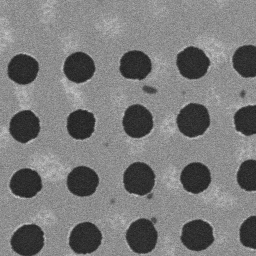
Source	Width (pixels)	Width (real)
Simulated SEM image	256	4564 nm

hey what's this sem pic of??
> a regular array of holes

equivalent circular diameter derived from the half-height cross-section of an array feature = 569 nanometres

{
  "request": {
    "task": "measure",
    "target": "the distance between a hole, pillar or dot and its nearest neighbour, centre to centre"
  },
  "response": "1000 nm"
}